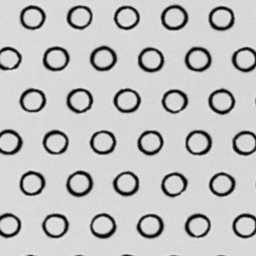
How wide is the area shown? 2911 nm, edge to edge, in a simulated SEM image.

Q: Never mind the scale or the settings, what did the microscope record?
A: a regular array of ring-shaped grooves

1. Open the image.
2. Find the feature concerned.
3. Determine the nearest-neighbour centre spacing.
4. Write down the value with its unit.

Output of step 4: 538 nanometers